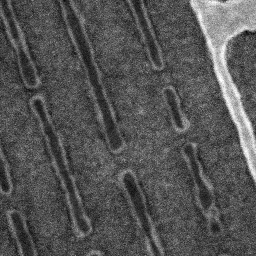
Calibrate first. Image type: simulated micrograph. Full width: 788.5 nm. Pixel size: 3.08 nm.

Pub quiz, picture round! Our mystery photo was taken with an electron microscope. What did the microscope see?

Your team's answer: one or a few lines or trenches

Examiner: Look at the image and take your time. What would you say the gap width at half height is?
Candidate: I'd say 151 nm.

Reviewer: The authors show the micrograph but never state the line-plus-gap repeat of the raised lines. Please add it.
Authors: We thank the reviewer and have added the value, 191 nm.